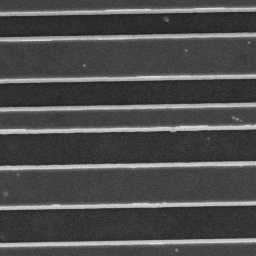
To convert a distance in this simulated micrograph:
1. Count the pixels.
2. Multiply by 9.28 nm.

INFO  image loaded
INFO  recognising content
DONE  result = one or a few lines or trenches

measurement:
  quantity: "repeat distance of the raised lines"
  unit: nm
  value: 593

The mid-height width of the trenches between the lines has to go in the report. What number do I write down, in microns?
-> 0.294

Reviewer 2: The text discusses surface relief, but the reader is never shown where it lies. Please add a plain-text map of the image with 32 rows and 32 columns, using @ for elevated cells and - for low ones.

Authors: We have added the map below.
@@@@@@@@@@@@@@@@@@@@@@@@@@@@@@@@
@@@@@@@@@@@@@@@@----------------
--------------------------------
--------------------------------
---------------------@--@-@@@@@@
@@@@@@@@@@@@@@@@@@@@@@@@@@@@@@@@
@@@@@@@@@@@@@@@@@@@@@@@@@@@@@@@@
@@@@@@@@@@@@@@@@@@@@@@@@@@@@@@@@
@@@@@@@@@@@@@@@@@@@@@@@@@@@@@@@@
@@@@@@@@@@@@@@@@@@@@@@@@@@@@@@@@
--------------------------------
--------------------------------
--------------------------------
----------@@@@-@@@@@@@@@@@@@@@@@
@@@@@@@@@@@@@@@@@@@@@@@@@@@@@@@@
@@@@@@@@@@@@@@@@@@@@@@@@@@@@@@@@
@-------------------------------
--------------------------------
--------------------------------
--------------------------------
------------------------------@@
@@@@@@@@@@@@@@@@@@@@@@@@@@@@@@@@
@@@@@@@@@@@@@@@@@@@@@@@@@@@@@@@@
@@@@@@@@@@@@@@@@@@@@@@@@@@@@@@@@
@@@@@@@@@@@@@@@@@@@@@@@@@@@@@@@@
@@@@@@@@@@@@@@@@@@@@@@@@@@@@----
--------------------------------
--------------------------------
--------------------------------
--------------------------------
-----------@@@@@@@@@@@@@@@@@@@@@
@@@@@@@@@@@@@@@@@@@@@@@@@@@@@@@@